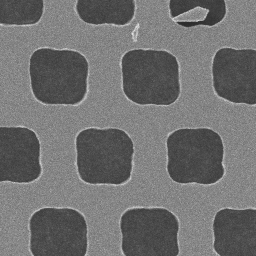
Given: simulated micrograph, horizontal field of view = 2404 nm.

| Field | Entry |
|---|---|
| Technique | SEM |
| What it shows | holes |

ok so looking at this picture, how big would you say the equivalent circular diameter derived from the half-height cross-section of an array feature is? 0.565 µm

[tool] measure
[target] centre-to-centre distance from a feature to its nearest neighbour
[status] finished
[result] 0.855 microns